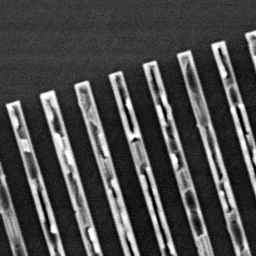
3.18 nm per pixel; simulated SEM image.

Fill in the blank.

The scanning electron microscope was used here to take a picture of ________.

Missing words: parallel lines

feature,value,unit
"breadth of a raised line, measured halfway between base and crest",41.2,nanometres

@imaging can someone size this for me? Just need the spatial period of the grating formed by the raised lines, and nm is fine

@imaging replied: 113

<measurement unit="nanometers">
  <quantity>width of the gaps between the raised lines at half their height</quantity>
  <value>73.2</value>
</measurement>